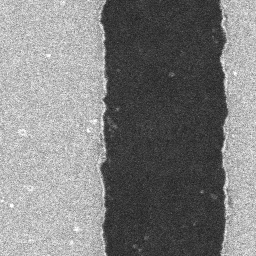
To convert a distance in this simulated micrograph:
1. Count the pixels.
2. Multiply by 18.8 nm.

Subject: one or a few lines or trenches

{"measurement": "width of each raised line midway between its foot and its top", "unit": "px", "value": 123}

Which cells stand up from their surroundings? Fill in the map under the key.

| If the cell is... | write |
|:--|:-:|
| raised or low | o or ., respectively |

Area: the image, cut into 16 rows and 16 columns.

......oooooooo..
......oooooooo..
......oooooooo..
......oooooooo..
......oooooooo..
......oooooooo..
......oooooooo..
......oooooooo..
......oooooooo..
......oooooooo..
......oooooooo..
......oooooooo..
......oooooooo..
......oooooooo..
......oooooooo..
......oooooooo..